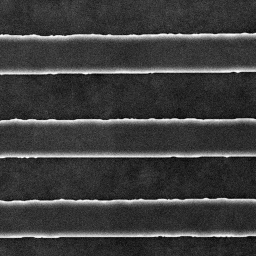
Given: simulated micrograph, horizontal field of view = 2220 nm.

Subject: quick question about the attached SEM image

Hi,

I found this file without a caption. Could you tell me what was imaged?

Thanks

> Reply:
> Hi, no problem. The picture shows lines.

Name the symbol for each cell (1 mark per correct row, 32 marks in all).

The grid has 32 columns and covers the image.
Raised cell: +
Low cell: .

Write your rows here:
................................
................................
................................
................................
++.++....+++++..++++++++++++++++
++++++++++++++++++++++++++++++++
++++++++++++++++++++++++++++++++
++++++++++++++++++++++++++++++++
++++++++++++++++++++++++++++++++
................................
................................
................................
................................
................................
................................
++++++++++++++++++++++++++++++++
++++++++++++++++++++++++++++++++
++++++++++++++++++++++++++++++++
++++++++++++++++++++++++++++++++
+++++++++++++++++++++++++...+...
................................
................................
................................
................................
................................
++++++++++++++++++++++++++++++++
++++++++++++++++++++++++++++++++
++++++++++++++++++++++++++++++++
++++++++++++++++++++++++++++++++
+++++++++++++++++++++++.+++++++.
................................
................................